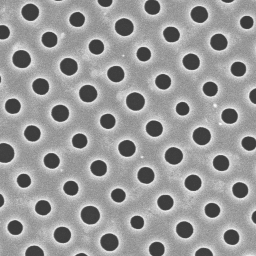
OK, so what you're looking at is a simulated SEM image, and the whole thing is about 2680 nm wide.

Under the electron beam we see a regular array of holes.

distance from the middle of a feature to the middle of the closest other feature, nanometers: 348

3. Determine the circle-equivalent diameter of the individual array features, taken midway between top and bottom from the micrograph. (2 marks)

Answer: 0.171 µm